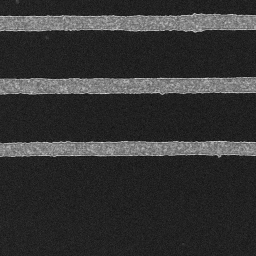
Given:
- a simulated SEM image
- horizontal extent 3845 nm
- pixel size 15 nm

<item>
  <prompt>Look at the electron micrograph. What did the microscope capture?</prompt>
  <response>one or a few lines or trenches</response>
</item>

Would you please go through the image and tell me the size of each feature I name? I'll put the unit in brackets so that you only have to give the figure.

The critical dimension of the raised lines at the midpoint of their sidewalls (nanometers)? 210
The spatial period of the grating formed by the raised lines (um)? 0.945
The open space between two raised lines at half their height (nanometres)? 731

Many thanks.